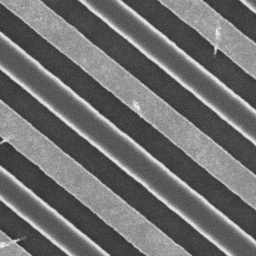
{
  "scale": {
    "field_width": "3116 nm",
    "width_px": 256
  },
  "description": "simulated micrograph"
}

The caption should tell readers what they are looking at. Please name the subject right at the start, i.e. lines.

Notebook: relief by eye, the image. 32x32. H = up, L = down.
HHHHHLLLLLHHHHHHLLLLHHHHHHLLLLLH
LLHHHHHLLLLLHHHHHLLLLLHHHHHLLLLL
LLLHHHHHLLLLLHHHHHLLLLLHHHHHLLLL
LLLLHHHHHLLLLLHHHHHLLLLLHHHHHLLL
HLLLLHHHHHLLLLLHHHHHHLLLLHHHHHHL
HHLLLLHHHHHHLLLLLHHHHHLLLLLHHHHH
HHHLLLLLHHHHHLLLLLHHHHHLLLLLHHHH
HHHHLLLLLHHHHHLLLLLHHHHHLLLLLHHH
HHHHHLLLLLHHHHHLLLLLHHHHHLLLLLHH
LHHHHHHLLLLHHHHHHLLLLHHHHHHLLLLH
LLHHHHHHLLLLLHHHHHLLLLLHHHHHLLLL
LLLLHHHHHLLLLLHHHHHLLLLLHHHHHLLL
LLLLLHHHHHLLLLLHHHHHLLLLLHHHHHLL
HLLLLLHHHHHHLLLLHHHHHHLLLLHHHHHH
HHLLLLLHHHHHHLLLLHHHHHHLLLLHHHHH
HHHHLLLLHHHHHHLLLLLHHHHHLLLLLHHH
HHHHHLLLLLHHHHHLLLLLHHHHHLLLLLHH
LHHHHHLLLLLHHHHHHLLLLHHHHHHLLLLH
LLHHHHHLLLLLHHHHHHLLLLHHHHHHLLLL
LLLHHHHHHLLLLHHHHHHLLLLLHHHHHLLL
LLLLHHHHHHLLLLLHHHHHLLLLLHHHHHLL
HLLLLLHHHHHLLLLLHHHHHLLLLLHHHHHL
HHLLLLLHHHHHLLLLLHHHHHHLLLLHHHHH
HHHLLLLLHHHHHHLLLLHHHHHHLLLLLHHH
HHHHHLLLLHHHHHHLLLLHHHHHHLLLLLHH
LHHHHHLLLLHHHHHHLLLLLHHHHHLLLLLH
LLHHHHHLLLLLHHHHHLLLLLHHHHHHLLLL
LLLHHHHHLLLLLHHHHHLLLLLHHHHHHLLL
LLLLHHHHHLLLLLHHHHHHLLLLHHHHHHLL
HLLLLLHHHHHLLLLHHHHHHLLLLHHHHHHL
HHLLLLLHHHHHLLLLHHHHHHLLLLLHHHHH
HHHLLLLLHHHHHLLLLLHHHHHLLLLLHHHH